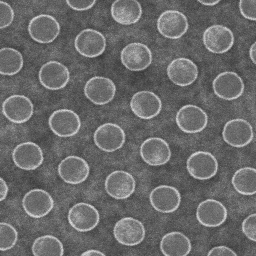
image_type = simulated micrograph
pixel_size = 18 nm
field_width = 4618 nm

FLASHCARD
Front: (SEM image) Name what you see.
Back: a regular array of raised bodies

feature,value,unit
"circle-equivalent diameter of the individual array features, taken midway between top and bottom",506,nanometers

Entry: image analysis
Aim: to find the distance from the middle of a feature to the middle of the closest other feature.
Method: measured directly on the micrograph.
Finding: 861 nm